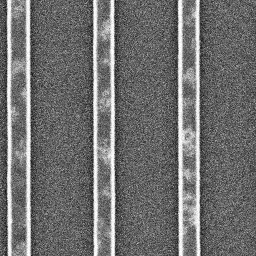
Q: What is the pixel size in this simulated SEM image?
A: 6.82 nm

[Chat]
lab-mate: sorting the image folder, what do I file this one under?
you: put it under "one or a few lines or trenches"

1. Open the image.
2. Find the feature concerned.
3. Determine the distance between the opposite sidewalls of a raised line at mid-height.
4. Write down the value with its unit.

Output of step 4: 127 nm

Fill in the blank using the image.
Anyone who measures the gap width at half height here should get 451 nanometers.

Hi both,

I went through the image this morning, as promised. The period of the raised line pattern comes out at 581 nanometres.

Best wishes